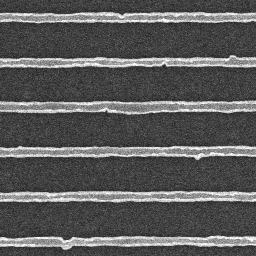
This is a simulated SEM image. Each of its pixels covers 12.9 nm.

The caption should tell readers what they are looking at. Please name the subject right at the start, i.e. parallel lines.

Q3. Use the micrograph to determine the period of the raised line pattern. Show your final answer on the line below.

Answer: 578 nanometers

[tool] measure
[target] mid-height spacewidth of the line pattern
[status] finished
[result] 461 nm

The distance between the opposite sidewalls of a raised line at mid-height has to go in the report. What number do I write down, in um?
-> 0.11